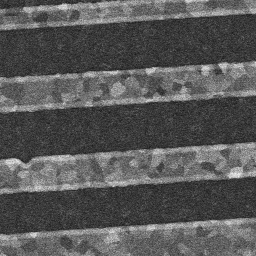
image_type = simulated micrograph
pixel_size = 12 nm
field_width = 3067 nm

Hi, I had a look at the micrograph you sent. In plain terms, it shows one or a few lines or trenches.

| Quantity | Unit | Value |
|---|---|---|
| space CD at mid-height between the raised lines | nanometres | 632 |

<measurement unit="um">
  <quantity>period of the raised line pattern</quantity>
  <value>0.953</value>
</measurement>